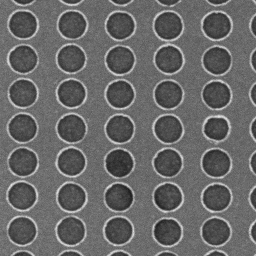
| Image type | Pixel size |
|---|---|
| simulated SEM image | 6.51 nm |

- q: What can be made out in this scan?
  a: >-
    a regular array of holes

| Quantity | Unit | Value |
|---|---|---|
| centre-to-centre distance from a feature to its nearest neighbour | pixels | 33.9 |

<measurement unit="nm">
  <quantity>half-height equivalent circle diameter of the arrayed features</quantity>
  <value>186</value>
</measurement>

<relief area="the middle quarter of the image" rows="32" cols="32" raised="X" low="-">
-----XXXXXX------XXXXXX-------XX
----XXXXXXXX-----XXXXXXX-----XXX
XXXXXXXXXXXXX--XXXXXXXXXXXXXXXXX
XXXXXXXXXXXXXXXXXXXXXXXXXXXXXXXX
----XXXXXXXXX---XXXXXXXX----XXXX
-----XXXXXX------XXXXXX------XXX
-----XXXXXX------XXXXXX-------XX
------XXXX--------XXXX--------XX
-----XXXXX--------XXXXX-------XX
-----XXXXXX------XXXXXX------XXX
----XXXXXXXX----XXXXXXXX----XXXX
XXXXXXXXXXXXXXXXXXXXXXXXXXXXXXXX
XX-XXXXXXXXXXXXXXXXXXXXXXXXXXXXX
----XXXXXXXX----XXXXXXXX----XXXX
-----XXXXXX------XXXXXX------XXX
------XXXX--------XXXX--------XX
------XXXX--------XXXX--------XX
-----XXXXXX------XXXXXX-------XX
-----XXXXXX------XXXXXX------XXX
X---XXXXXXXXX---XXXXXXXXX---XXXX
XXXXXXXXXXXXXXXXXXXXXXXXXXXXXXXX
----XXXXXXXX---XXXXXXXXXX---XXXX
-----XXXXXX-----XXXXXXX------XXX
-----XXXXX-------XXXXXX------XXX
------XXXX-------XXXXX--------XX
-----XXXXX-------XXXXXX------XXX
-----XXXXXX------XXXXXX------XXX
----XXXXXXX-----XXXXXXXX----XXXX
XXXXXXXXXXXXX--XXXXXXXXXXXXXXXXX
XXXXXXXXXXXXXXXXXXXXXXXXXXXXXXXX
----XXXXXXXX---XXXXXXXXX----XXXX
-----XXXXXX------XXXXXX------XXX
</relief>